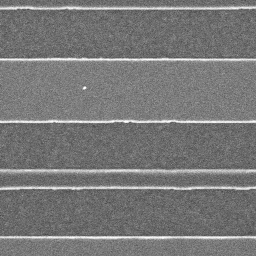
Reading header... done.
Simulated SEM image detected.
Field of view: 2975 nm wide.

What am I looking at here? lines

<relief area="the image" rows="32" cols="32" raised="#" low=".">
################################
................................
................................
................................
................................
................................
................................
################################
################################
################################
################################
################################
################################
################################
################################
................................
................................
................................
................................
................................
................................
################################
################################
################################
................................
................................
................................
................................
................................
................................
################################
################################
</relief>